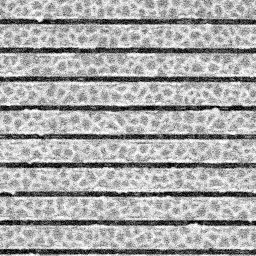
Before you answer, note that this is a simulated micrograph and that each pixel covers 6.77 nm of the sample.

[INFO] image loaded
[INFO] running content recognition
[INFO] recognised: parallel lines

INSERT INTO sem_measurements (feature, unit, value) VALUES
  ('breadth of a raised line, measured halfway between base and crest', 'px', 22.6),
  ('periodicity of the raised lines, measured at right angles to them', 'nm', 195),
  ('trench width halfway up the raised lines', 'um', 0.0389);